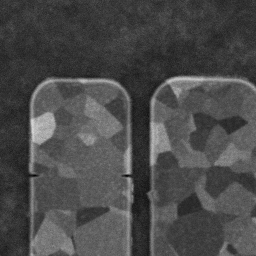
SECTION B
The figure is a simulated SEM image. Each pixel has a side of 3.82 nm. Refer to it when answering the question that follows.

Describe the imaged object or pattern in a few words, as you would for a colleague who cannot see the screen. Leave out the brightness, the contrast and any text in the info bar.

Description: one or a few lines or trenches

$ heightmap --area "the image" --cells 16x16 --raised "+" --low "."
................
................
................
................
................
..++++++..++++++
..++++++..++++++
..++++++..++++++
..++++++..++++++
..++++++..++++++
..++++++..++++++
..++++++..++++++
..++++++.+++++++
..++++++..++++++
..++++++..++++++
..++++++..++++++